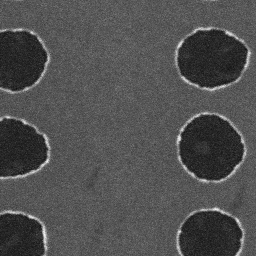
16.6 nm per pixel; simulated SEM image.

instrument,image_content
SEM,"holes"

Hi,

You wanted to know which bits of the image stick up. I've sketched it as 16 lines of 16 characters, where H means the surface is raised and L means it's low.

HHHHHHHHHHHHHHHH
HHHHHHHHHHHHHHHH
LLHHHHHHHHHHLLLH
LLLHHHHHHHHLLLLH
LLLHHHHHHHHLLLLH
LLHHHHHHHHHHHHHH
HHHHHHHHHHHHHHHH
LHHHHHHHHHHHLLHH
LLLHHHHHHHHLLLLH
LLLHHHHHHHHLLLLH
LLHHHHHHHHHHLLLH
HHHHHHHHHHHHHHHH
HHHHHHHHHHHHHHHH
LLHHHHHHHHHHLLHH
LLLHHHHHHHHLLLLH
LLLHHHHHHHHLLLLH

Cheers